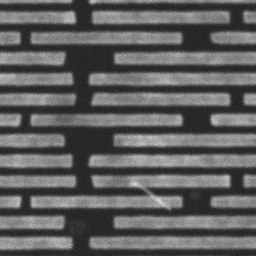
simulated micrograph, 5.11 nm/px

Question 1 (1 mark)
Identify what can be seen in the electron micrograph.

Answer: wiring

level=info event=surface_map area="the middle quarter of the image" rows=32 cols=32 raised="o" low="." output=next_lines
................................
................................
.................oooo...........
oo.....ooooooooooooooooooooooooo
oo....oooooooooooooooooooooooooo
................................
................................
........oo......oooooo..........
ooo....ooooooooooooooooooooooooo
ooo....ooooooooooooooooooooooooo
................................
................................
................................
ooooooooooooooooooooooooooooo...
ooooooooooooooooooooooooooooo...
................................
................................
................................
.............ooooooooooooooooooo
.............ooooooooooooooooooo
................................
................................
................................
oo.....ooooooooooooooooooooooooo
oo....oooooooooooooooooooooooooo
oo....oooooooooooooooooooooooooo
................................
................................
ooo....ooooooooooooooooooooooooo
ooo....ooooooooooooooooooooooooo
.oo.....oooooooooooooooooooooooo
................................